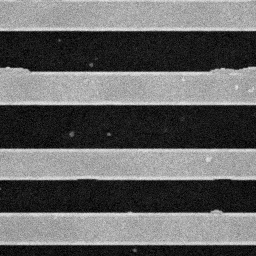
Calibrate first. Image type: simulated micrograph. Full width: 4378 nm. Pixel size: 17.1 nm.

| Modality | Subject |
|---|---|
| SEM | lines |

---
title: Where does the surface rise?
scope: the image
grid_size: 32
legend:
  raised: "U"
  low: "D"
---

UUUUUUUUUUUUUUUUUUUUUUUUUUUUUUUU
UUUUUUUUUUUUUUUUUUUUUUUUUUUUUUUU
UUUUUUUUUUUUUUUUUUUUUUUUUUUUUUUU
UUUUUUUUUUUUUUUUUUUUUUUUUUUUUUUU
DDDDDDDDDDDDDDDDDDDDDDDDDDDDDDDD
DDDDDDDDDDDDDDDDDDDDDDDDDDDDDDDD
DDDDDDDDDDDDDDDDDDDDDDDDDDDDDDDD
DDDDDDDDDDDDDDDDDDDDDDDDDDDDDDDD
DDDDDDDDDDDDDDDDDDDDDDDDDDDDDDDU
UUUUUUUUUUUUUUUUUUUUUUUUUUUUUUUU
UUUUUUUUUUUUUUUUUUUUUUUUUUUUUUUU
UUUUUUUUUUUUUUUUUUUUUUUUUUUUUUUU
UUUUUUUUUUUUUUUUUUUUUUUUUUUUUUUU
DDDDDDDDDDDDDDDDDDDDDDDDDDDDDDDD
DDDDDDDDDDDDDDDDDDDDDDDDDDDDDDDD
DDDDDDDDDDDDDDDDDDDDDDDDDDDDDDDD
DDDDDDDDDDDDDDDDDDDDDDDDDDDDDDDD
DDDDDDDDDDDDDDDDDDDDDDDDDDDDDDDD
DDDDDDDDDDDDDDDDDDDDDDDDDDDDDDDD
UUUUUUUUUUUUUUUUUUUUUUUUUUUUUUUU
UUUUUUUUUUUUUUUUUUUUUUUUUUUUUUUU
UUUUUUUUUUUUUUUUUUUUUUUUUUUUUUUU
DDDDDDDDDDDDDDDDDDDDDDDDDDDDDDDD
DDDDDDDDDDDDDDDDDDDDDDDDDDDDDDDD
DDDDDDDDDDDDDDDDDDDDDDDDDDDDDDDD
DDDDDDDDDDDDDDDDDDDDDDDDDDDDDDDD
DDDDDDDDDDDDDDDDDDDDDDDDDDDDDDDD
UUUUUUUUUUUUUUUUUUUUUUUUUUUUUUUU
UUUUUUUUUUUUUUUUUUUUUUUUUUUUUUUU
UUUUUUUUUUUUUUUUUUUUUUUUUUUUUUUU
DDDDDDDDDDDDDDDDDDDDDDDDDDDDDDDD
DDDDDDDDDDDDDDDDDDDDDDDDDDDDDDDD